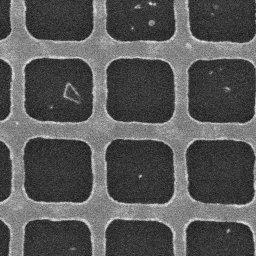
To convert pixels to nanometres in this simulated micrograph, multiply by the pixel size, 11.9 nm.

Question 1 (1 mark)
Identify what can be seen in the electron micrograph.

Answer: holes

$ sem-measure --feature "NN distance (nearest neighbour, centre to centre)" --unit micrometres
0.959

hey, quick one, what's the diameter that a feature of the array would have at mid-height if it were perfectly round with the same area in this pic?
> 865 nm